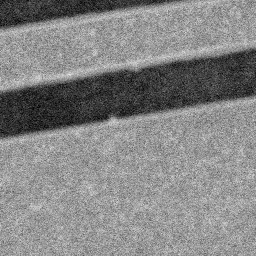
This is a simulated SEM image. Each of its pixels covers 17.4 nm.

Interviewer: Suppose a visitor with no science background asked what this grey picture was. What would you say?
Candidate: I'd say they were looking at one or a few lines or trenches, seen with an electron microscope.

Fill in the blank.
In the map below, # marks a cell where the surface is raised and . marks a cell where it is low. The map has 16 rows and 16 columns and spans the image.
..........######
...#############
################
############....
######..........
#...............
..............##
........########
..##############
################
################
################
################
################
################
################